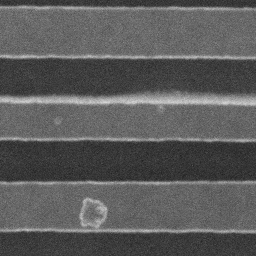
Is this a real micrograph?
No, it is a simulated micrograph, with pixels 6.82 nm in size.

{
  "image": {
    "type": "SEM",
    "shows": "lines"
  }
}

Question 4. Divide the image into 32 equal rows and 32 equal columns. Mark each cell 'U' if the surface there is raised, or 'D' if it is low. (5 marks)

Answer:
DDDDDDDDDDDDDDDDDDDDDDDDDDDDDDDD
UUUUUUUUUUUUUUUUUUUUUUUUUUUUUUUU
UUUUUUUUUUUUUUUUUUUUUUUUUUUUUUUU
UUUUUUUUUUUUUUUUUUUUUUUUUUUUUUUU
UUUUUUUUUUUUUUUUUUUUUUUUUUUUUUUU
UUUUUUUUUUUUUUUUUUUUUUUUUUUUUUUU
UUUUUUUUUUUUUUUUUUUUUUUUUUUUUUUU
DDDDDDDDDDDDDDDDDDDDDDDDDDDDDDDD
DDDDDDDDDDDDDDDDDDDDDDDDDDDDDDDD
DDDDDDDDDDDDDDDDDDDDDDDDDDDDDDDD
DDDDDDDDDDDDDDDDDDDDDDDDDDDDDDDD
DDDDDDDDDDDDDDDDDDDDDDDDDDDDDDDD
DDDDDDDDDDDDDDDDDDDDDDDDDDDDDDDD
UUUUUUUUUUUUUUUUUUUUUUUUUUUUUUUU
UUUUUUUUUUUUUUUUUUUUUUUUUUUUUUUU
UUUUUUUUUUUUUUUUUUUUUUUUUUUUUUUU
UUUUUUUUUUUUUUUUUUUUUUUUUUUUUUUU
DDDDDUUDDDDDDDDDUUUUUDUUUUUUUUUU
DDDDDDDDDDDDDDDDDDDDDDDDDDDDDDDD
DDDDDDDDDDDDDDDDDDDDDDDDDDDDDDDD
DDDDDDDDDDDDDDDDDDDDDDDDDDDDDDDD
DDDDDDDDDDDDDDDDDDDDDDDDDDDDDDDD
DDDDDDDDDDDDDDDDDDDDDDDDDDDDDDDD
UUUUUUUUUUUUUUUUUUUUUUUUUUUUUUUU
UUUUUUUUUUUUUUUUUUUUUUUUUUUUUUUU
UUUUUUUUUUUUUUUUUUUUUUUUUUUUUUUU
UUUUUUUUUUUUUUUUUUUUUUUUUUUUUUUU
UUUUUUUUUUUUUUUUUUUUUUUUUUUUUUUU
UUUUUUUUUUUUUUUUUUUUUUUUUUUUUUUU
DDDDDDDDDDDDDDDDDDDDDDDDDDDDDDDD
DDDDDDDDDDDDDDDDDDDDDDDDDDDDDDDD
DDDDDDDDDDDDDDDDDDDDDDDDDDDDDDDD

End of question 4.